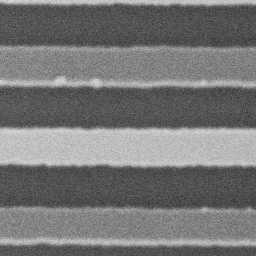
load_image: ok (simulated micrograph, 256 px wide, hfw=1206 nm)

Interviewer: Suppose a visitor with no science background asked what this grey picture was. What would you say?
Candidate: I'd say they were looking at lines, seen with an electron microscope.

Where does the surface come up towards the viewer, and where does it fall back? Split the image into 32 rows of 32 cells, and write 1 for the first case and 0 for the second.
00000011111111001111111111111101
00000000000000000000000000000000
00000000000000000000000000000000
00000000000000000000000000000000
00000000000000000000000000000000
00000000000000000000000000000000
11111111111111111111111111111111
11111111111111111111111111111111
11111111111111111111111111111111
11111111111111111111111111111111
11111111111111111111111111111111
00000000000000000000000000000000
00000000000000000000000000000000
00000000000000000000000000000000
00000000000000000000000000000000
00000000000000000000000000000000
11111111111111111111111111111111
11111111111111111111111111111111
11111111111111111111111111111111
11111111111111111111111111111111
10111111111111111111111111111111
00000000000000000000000000000000
00000000000000000000000000000000
00000000000000000000000000000000
00000000000000000000000000000000
00000000000000000000000000000000
11111111111111111111111111111111
11111111111111111111111111111111
11111111111111111111111111111111
11111111111111111111111111111111
00100001000111111111111111111111
00000000000000000000000000000000